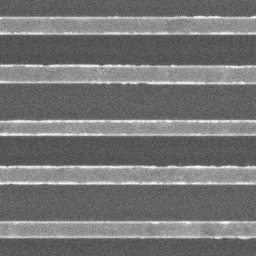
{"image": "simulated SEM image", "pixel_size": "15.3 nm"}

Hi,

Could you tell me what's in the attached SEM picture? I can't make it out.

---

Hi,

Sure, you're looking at lines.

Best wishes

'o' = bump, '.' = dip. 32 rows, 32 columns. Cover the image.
................................
................................
oooooooooooooooooooooooooooooooo
oooooooooooooooooooooooooooooooo
................................
................................
................................
................................
oooooooooooooooooooooooooooooooo
oooooooooooooooooooooooooooooooo
................................
................................
................................
................................
................................
oooooooooooooooooooooooooooooooo
oooooooooooooooooooooooooooooooo
................................
................................
................................
................................
oooooooooooooooooooooooooooooooo
oooooooooooooooooooooooooooooooo
................................
................................
................................
................................
................................
oooooooooooooooooooooooooooooooo
oooooooooooooooooooooooooooooooo
................................
................................